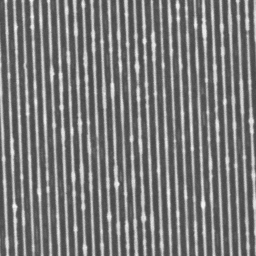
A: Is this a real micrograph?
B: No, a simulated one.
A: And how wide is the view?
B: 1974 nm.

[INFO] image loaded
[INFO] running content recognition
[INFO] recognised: parallel lines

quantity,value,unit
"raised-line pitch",8.59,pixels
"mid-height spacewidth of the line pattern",52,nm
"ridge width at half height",1.75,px